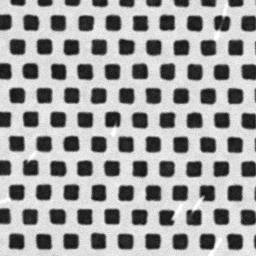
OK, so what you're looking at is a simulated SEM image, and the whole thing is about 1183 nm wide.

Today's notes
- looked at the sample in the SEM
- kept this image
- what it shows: a regular array of holes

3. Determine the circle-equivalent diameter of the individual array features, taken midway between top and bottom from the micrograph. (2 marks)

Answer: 82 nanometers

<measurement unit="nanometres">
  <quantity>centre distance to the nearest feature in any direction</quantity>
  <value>125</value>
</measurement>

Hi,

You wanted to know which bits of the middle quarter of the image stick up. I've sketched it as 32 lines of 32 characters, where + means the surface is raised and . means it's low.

+++....+++....+++....+++....+++.
.++....+++....+++....+++....+++.
.++.....++....+++....+++....+++.
++++...+++....+++....+++....+++.
++++++++++++++++++++++++++++++++
++++++++++++++++++++++++++++++++
....+++....+++....++....+++....+
....+++....+++....++.....++....+
....+++....+++....++.....++....+
....+++....+++....++....+++....+
++++++++++++++++++++++++++++++++
++++++++++++++++++++++++++++++++
+++....+++....+++....+++....+++.
.++....+++....+++....+++....++..
.++....+++....+++....+++....++..
++++...+++..+.+++....+++....+++.
++++++++++++++++++++++++++++++++
++++++++++++++++++++++++++++++++
....+++...++++...+++....+++....+
....+++....++.....++.....++....+
....+++....++.....++.....++....+
....+++....+++....++....+++....+
++++++++++++++++++++++++++++++++
++++++++++++++++++++++++++++++++
+++....+++....+++....+++...++++.
.++....+++....+++....+++....++..
.++....+++....+++....+++....++..
.++....+++....+++....+++....++..
++++++++++++++++++++++++++++++++
++++++++++++++++++++++++++++++++
....+++...++++...++++...++++...+
....+++...++++....++....+++....+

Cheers